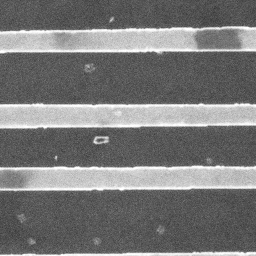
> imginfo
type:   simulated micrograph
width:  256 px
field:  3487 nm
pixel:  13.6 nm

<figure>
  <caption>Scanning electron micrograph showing lines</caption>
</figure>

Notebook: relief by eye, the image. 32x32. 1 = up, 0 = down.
00000000000000000000000000000000
00000000000000000000000000000000
00000000000000000000000000000000
00000000000000000000000000011111
11111111111111111111111111111111
11111111111111111111111111111111
10000000000000000000000000000000
00000000000000000000000000000000
00000000000000000000000000000000
00000000000000000000000000000000
00000000000000000000000000000000
00000000000000000000000000000000
00000000000000000000000000000000
11111111111111111111111111111111
11111111111111111111111111111111
11111111111111111111111111111111
00000000000000000000000000000000
00000000000010000000000000000000
00000000000000000000000000000000
00000000000000000000000000000000
00000000000000000000000000000000
11111111111111111111111111111111
11111111111111111111111111111111
11111111111111111111111100000000
00000000000000000000000000000000
00000000000000000000000000000000
00000000000000000000000000000000
00000000000000000000000000000000
00000000000000000000000000000000
00000000000000000000000000000000
00000000000000000000000000000000
00000000000000000000000000000000